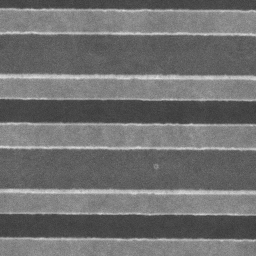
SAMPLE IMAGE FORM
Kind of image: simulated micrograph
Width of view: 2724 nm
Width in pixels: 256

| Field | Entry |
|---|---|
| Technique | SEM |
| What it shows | lines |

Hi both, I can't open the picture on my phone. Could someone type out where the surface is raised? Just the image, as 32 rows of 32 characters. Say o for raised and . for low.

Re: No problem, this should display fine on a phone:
................................
oooooooooooooooooooooooooooooooo
oooooooooooooooooooooooooooooooo
oooooooooooooooooooooooooooooooo
................................
................................
................................
................................
................................
................................
oooooooooooooooooooooooooooooooo
oooooooooooooooooooooooooooooooo
..............................oo
................................
................................
oooo.o.o.oo.....................
oooooooooooooooooooooooooooooooo
oooooooooooooooooooooooooooooooo
......................o.oo.ooooo
................................
................................
................................
................................
................................
oooooooooooooooooooooooooooooooo
oooooooooooooooooooooooooooooooo
oooooooooooooooooooooooooooooooo
................................
................................
................................
oooooooooooooooooooooooooooooooo
oooooooooooooooooooooooooooooooo